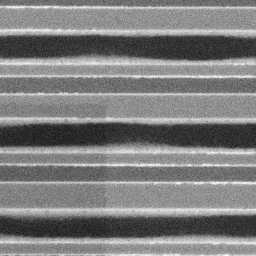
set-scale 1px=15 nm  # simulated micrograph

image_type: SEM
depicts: lines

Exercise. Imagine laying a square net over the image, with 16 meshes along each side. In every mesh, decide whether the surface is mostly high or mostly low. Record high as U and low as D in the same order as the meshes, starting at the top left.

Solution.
UUUUUUUUUUUUUUUU
UUUUUUUUUUUUUUUU
DDDDDDDDDDDDDDDD
DDDDDDDDDDDDDDDD
UUUUUUUUUUUUUUUU
UUUUUUUUUUUUUUUU
UUUUUUUUUUUUUUUU
DDDDDDDDDDDDDDDD
DDDDDDDDDDDDDDDD
UUUUUUUUUUUDUDDD
UUUUUUUUUUUUUUUU
UUUUUUUUUUUUUUUU
UUUUUUUUUUUUUUUU
DDDDDDDDDDDDDDDD
DDDDDDDDDDDDDDDD
UUUUUUUUUUUUUUUU